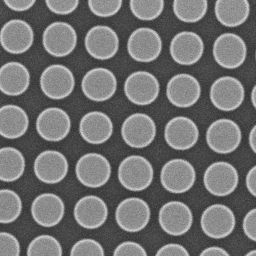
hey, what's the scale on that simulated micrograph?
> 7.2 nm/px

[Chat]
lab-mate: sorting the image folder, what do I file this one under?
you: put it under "an array of small figures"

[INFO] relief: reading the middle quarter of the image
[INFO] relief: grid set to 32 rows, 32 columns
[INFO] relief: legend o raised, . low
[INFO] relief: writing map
................................
o......oooo.....................
oo....oooooo.....ooooo..........
oo...oooooooo...ooooooo....ooooo
oo...oooooooo...ooooooo....ooooo
oo...oooooooo..ooooooooo..oooooo
oo...oooooooo..oooooooo...oooooo
o....ooooooo....ooooooo...oooooo
......ooooo.....ooooooo...oooooo
.................ooooo.....ooooo
.............................oo.
................................
o.....oooo......................
o....oooooo.....ooooo.......oo..
o...oooooooo...ooooooo....oooooo
o...oooooooo...oooooooo...oooooo
o...oooooooo...oooooooo..ooooooo
o...oooooooo...oooooooo..ooooooo
.....oooooo....ooooooo...ooooooo
......ooo.......oooooo....oooooo
.................ooo.......ooooo
................................
.......o........................
....oooooo......oooo............
o...ooooooo....oooooo.....ooooo.
o..oooooooo...oooooooo...ooooooo
o..oooooooo...oooooooo...ooooooo
...oooooooo...oooooooo..oooooooo
....ooooooo...oooooooo..oooooooo
....oooooo....oooooooo...ooooooo
......oo.......oooooo....ooooooo
.................oo.......ooooo.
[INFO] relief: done